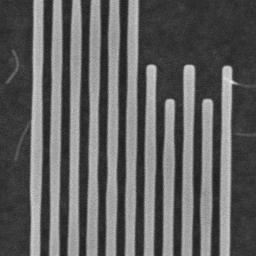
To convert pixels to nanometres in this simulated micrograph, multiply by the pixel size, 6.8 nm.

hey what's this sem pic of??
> groups of lines, slits or small figures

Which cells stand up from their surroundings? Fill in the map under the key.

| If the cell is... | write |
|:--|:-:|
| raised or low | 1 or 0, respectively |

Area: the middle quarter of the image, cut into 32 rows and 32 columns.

00110011100110001100011000000011
00110011100110001100011000000011
00110011100110001100011000000011
00110011100110001100011000000011
00110011100110001100011000000011
00110011100110001100011000000011
00110011100110001100011000000011
00110001100110001100011000000011
00110001000110001100011000000011
00110001000110001100011001110011
00110001000110001100011001110011
00110001000110001100111001110011
00110001000110001100111001110011
00110001000110001100111001110011
00110001000110001100111001110011
00110001000110001100111001100011
00110011000110001100111001100011
00110011000110001100111001100011
00110011000110001100111001100011
00110011000110001100111001100011
00110011000110001100111001110011
00110011000110001100111001110011
00110011000110001100111001110011
00110011000110001100111001110011
00110011000110001100111001110011
00110011000110001100111001110011
00110011000110001100111001110011
01110011000110001100111001110011
01110011000110001100111001110011
01110011000110001100111001100011
01110011000110001100111001100011
01110011000110001100111001100011